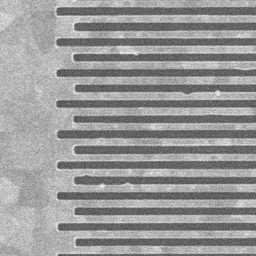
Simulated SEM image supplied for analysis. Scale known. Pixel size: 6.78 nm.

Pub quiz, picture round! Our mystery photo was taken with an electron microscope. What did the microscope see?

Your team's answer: parallel lines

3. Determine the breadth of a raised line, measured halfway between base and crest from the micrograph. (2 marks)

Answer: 49.2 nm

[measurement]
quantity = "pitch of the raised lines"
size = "15.4 px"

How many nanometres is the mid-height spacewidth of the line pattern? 55.9